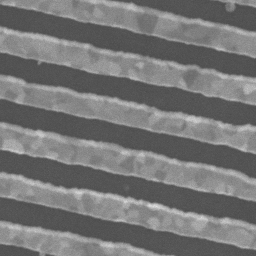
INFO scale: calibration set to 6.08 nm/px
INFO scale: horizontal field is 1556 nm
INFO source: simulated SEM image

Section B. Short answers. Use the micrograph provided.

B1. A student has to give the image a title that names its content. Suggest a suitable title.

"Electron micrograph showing lines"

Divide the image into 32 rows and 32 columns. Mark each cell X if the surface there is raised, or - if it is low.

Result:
XXXXXXXXXXXXXXXX--------------XX
-----XXXXXXXXXXXXXXXX-----------
---------XXXXXXXXXXXXXXXX-------
---------------XXXXXXXXXXXXXXX--
XXXXXX-------------XXXXXXXXXXXXX
XXXXXXXXXXX-------------XXXXXXXX
XXXXXXXXXXXXXXX-------------XXXX
-----XXXXXXXXXXXXXXX------------
---------XXXXXXXXXXXXXXXX-------
X-------------XXXXXXXXXXXXXXXX--
XXXX---------------XXXXXXXXXXXXX
XXXXXXXXX---------------XXXXXXXX
-XXXXXXXXXXXXXX--------------XXX
-----XXXXXXXXXXXXXX-------------
----------XXXXXXXXXXXXXX--------
X--------------XXXXXXXXXXXXX----
XXXXXX-------------XXXXXXXXXXXXX
XXXXXXXXXX---------------XXXXXXX
XXXXXXXXXXXXXXX--------------XXX
----XXXXXXXXXXXXXXXX------------
----------XXXXXXXXXXXXXXX-------
--------------XXXXXXXXXXXXXXXX--
XXXX---------------XXXXXXXXXXXXX
XXXXXXXX----------------XXXXXXXX
XXXXXXXXXXXXXXX--------------XXX
-----XXXXXXXXXXXXXXX------------
---------XXXXXXXXXXXXXX---------
-------------XXXXXXXXXXXXXXXX---
XXXX---------------XXXXXXXXXXXXX
XXXXXXXXXX--------------XXXXXXXX
XXXXXXXXXXXXXXXX-------------XXX
-----XXXXXXXXXXXXXX-------------